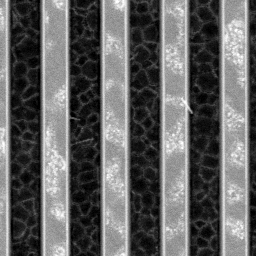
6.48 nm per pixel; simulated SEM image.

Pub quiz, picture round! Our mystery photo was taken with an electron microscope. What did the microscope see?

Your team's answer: parallel lines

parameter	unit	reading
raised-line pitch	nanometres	387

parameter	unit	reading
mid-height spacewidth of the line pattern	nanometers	219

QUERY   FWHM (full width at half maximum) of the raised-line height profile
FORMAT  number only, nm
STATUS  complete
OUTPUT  168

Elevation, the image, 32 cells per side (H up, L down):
HLLLLHHHHLLLLHHHLLLLHHHLLLLLHHHL
HLLLLHHHHLLLLHHHLLLLHHHLLLLLHHHL
HLLLLHHHHLLLLHHHLLLLHHHLLLLLHHHL
HLLLLHHHHLLLLHHHLLLLHHHLLLLLHHHL
HLLLLHHHHLLLLHHHLLLLHHHLLLLLHHHL
HLLLLHHHHLLLLHHHLLLLHHHLLLLLHHHL
HLLLLHHHHLLLLHHHLLLLHHHLLLLLHHHL
HLLLLHHHHLLLLHHHLLLLHHHLLLLLHHHL
HLLLLHHHHLLLLHHHLLLLHHHLLLLLHHHL
HLLLLHHHHLLLLHHHLLLLHHHLLLLLHHHL
HLLLLHHHHLLLLHHHLLLLHHHLLLLLHHHL
HLLLLHHHHLLLLHHHLLLLHHHLLLLLHHHL
HLLLLHHHHLLLLHHHLLLLHHHHLLLLHHHL
HLLLLHHHHLLLLHHHLLLLHHHHLLLLHHHL
HLLLLHHHHLLLLHHHLLLLHHHHLLLLHHHL
HLLLLHHHHLLLLHHHLLLLHHHHLLLLHHHL
HLLLLHHHHLLLLHHHLLLLHHHLLLLLHHHL
HLLLLHHHHLLLLHHHLLLLHHHLLLLLHHHL
HLLLLHHHHLLLLHHHLLLLHHHHLLLLHHHL
HLLLLHHHHLLLLHHHLLLLHHHHLLLLHHHL
HLLLLHHHHLLLLHHHLLLLHHHHLLLLHHHL
HLLLLHHHHLLLLHHHLLLLHHHHLLLLHHHL
HLLLLHHHLLLLLHHHLLLLHHHHLLLLHHHL
HLLLLHHHHLLLLHHHLLLLHHHHLLLLHHHL
HLLLLHHHHLLLLHHHLLLLHHHLLLLLHHHL
HLLLLHHHHLLLLHHHLLLLHHHLLLLLHHHL
HLLLLHHHHLLLLHHHLLLLHHHLLLLLHHHL
HLLLLHHHHLLLLHHHLLLLHHHLLLLLHHHL
HLLLLHHHHLLLLHHHLLLLHHHHLLLLHHHL
HLLLLHHHHLLLLHHHLLLLHHHHLLLLHHHL
HLLLLHHHHLLLLHHHLLLLHHHLLLLLHHHL
HLLLLHHHHLLLLHHHLLLLHHHLLLLLHHHL